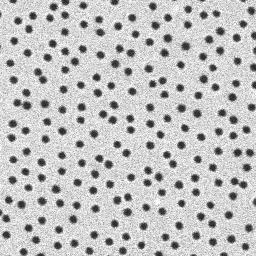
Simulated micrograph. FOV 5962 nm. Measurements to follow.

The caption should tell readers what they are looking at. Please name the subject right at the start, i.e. a regular array of holes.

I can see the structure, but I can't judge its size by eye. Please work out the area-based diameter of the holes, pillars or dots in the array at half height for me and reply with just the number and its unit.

202 nm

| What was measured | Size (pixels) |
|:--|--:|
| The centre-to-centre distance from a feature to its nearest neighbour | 15.2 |